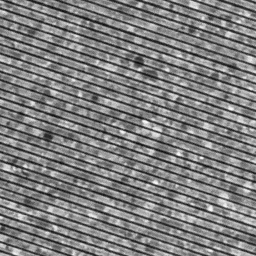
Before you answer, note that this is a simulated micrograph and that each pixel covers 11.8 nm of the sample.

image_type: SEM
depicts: parallel lines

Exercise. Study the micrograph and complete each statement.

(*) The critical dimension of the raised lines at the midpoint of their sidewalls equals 68.9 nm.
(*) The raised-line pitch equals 101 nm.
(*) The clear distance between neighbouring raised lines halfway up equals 35.1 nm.